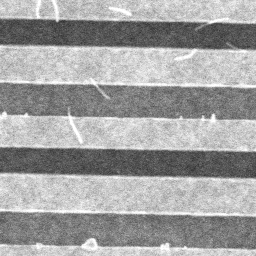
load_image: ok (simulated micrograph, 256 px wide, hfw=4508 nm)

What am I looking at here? lines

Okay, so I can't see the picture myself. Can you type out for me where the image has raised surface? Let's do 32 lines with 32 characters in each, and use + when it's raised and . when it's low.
++++++++++++++++++++++++++++++++
++++++++++++++++++++++++++++++++
...................+++++++++++++
................................
................................
................................
+++++++++++++++++++++++++++++++.
++++++++++++++++++++++++++++++++
++++++++++++++++++++++++++++++++
++++++++++++++++++++++++++++++++
............+...++++++++++++++++
................................
................................
................................
+..+....+.......................
++++++++++++++++++++++++++++++++
++++++++++++++++++++++++++++++++
++++++++++++++++++++++++++++++++
................++++++++++++++++
................................
................................
................................
+++++++++++++++++++++++++++.....
++++++++++++++++++++++++++++++++
++++++++++++++++++++++++++++++++
++++++++++++++++++++++++++++++++
..............++++++++++++++++++
................................
................................
................................
..........++....................
++++++++++++++++++++++++++++++++